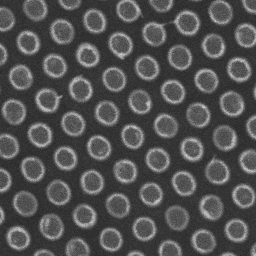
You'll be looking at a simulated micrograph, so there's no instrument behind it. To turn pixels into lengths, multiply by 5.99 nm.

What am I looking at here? a regular array of raised bodies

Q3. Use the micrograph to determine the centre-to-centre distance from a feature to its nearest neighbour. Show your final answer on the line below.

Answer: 207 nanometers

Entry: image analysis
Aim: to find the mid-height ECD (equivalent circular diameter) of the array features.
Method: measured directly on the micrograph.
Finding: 0.144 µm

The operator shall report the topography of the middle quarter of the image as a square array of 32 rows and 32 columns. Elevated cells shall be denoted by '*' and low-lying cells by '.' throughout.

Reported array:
*....***..........******...****.
*..........***....******........
..........*****...******........
...**.....*****....****.........
..****....*****..........****...
.******...*****..........*****..
.******....***..........******..
..*****..........****...******..
..****..........******...*****..
.........***....******....***...
........*****...******..........
........******...****..........*
****....******.....*...........*
*****...******.........****....*
*****....****..........*****...*
*****..........***.....*****....
*****..........****....*****....
.***..........******...*****....
.......***....******...........*
......*****....*****..........**
......******....***..........***
**....******..........***....***
***...*****..........*****...***
***....***..........******....**
***..........****....*****......
***..........*****...*****......
.............*****....***.......
.....****....*****..........***.
....******...*****.........*****
....******....***..........*****
*...******..........****...*****
*....****..........*****....****